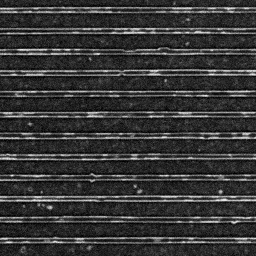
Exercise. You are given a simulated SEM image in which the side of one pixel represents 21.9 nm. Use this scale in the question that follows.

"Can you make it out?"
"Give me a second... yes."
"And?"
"parallel lines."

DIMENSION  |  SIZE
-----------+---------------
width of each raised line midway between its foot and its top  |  0.112 um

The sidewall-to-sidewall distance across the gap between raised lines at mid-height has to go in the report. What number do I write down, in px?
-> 16.2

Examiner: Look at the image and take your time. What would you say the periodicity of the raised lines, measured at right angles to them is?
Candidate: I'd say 460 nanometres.